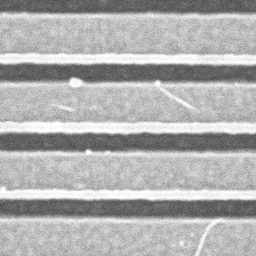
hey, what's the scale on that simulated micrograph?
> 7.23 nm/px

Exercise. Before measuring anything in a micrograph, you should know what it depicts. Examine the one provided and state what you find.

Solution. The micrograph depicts lines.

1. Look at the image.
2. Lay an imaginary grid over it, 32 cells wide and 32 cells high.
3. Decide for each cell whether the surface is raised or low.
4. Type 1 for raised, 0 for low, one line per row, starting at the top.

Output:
00000000000000000000000000000000
00000000000000000000000000000000
11111111111111111111111111111111
11111111111111111111111111111111
11111111111111111111111111111111
11111111111111111111111111111111
11111111111111111111111111111111
11111111111111111111111111111111
00000000000000000000000000000000
00000000000000000000000000000000
11111111111011111111110111111110
11111111111111111111111111111111
11111111111111111111111111111111
11111111111111111111111111111111
11111111111111111111111111111111
11111111111111111111111111111111
00000000110001111001011000001101
00000000000000000000000000000000
00000000000000000000000000000000
11111111111111111111111111111111
11111111111111111111111111111111
11111111111111111111111111111111
11111111111111111111111111111111
11111111111111111111111111111111
11111111111111111111111111111111
00000000000000000000000000000000
00000000000000000000000000000000
11111111111111100000111010011001
11111111111111111111111111111111
11111111111111111111111111111111
11111111111111111111111111111111
11111111111111111111111111111111